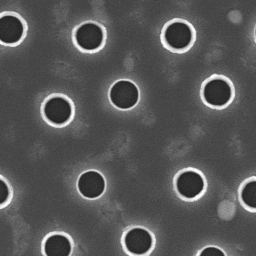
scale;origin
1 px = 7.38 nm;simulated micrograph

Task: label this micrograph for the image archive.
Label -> a regular array of holes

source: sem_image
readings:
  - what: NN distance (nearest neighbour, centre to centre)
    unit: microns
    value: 0.51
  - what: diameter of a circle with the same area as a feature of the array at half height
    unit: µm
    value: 0.207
